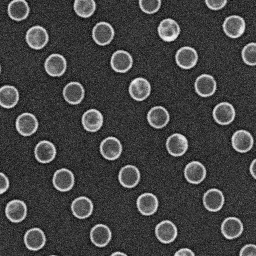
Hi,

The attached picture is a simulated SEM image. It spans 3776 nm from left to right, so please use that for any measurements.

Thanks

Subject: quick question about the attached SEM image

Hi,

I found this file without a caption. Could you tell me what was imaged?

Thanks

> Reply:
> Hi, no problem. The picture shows a regular array of raised bodies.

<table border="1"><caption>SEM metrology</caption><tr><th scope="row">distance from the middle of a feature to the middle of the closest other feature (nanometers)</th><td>490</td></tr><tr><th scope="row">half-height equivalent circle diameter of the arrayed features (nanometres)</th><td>306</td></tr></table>